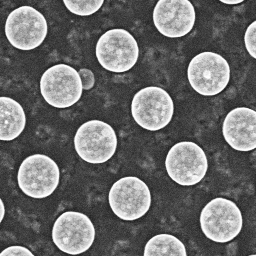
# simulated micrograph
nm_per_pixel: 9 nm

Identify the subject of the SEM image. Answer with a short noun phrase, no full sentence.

a regular array of raised bodies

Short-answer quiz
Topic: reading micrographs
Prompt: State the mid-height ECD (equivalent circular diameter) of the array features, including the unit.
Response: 42.1 px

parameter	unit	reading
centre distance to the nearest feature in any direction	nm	594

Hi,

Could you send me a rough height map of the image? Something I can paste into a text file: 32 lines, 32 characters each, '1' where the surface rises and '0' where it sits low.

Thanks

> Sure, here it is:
00000000111110000000111100000000
00111000011100000001111100000000
01111100000000000001111100000000
01111100000000000000111100000001
01111100000001110000011000000001
00111000000011111000000000000001
00000000000011111000000000000001
00000000000011111000000011110000
00000011100001110000000011111000
00000111110000000000000011111000
00000111110000000000000011110000
00000111110000000111100001100000
11000011110000000111100000000000
11100000000000001111110000000000
11100000000000000111100000001111
11100000000110000111100000001111
11100000001111000000000000001111
00000000011111100000000000001111
00000000011111000000001110000111
00001000001111000000011111000000
00011110000000000000011111000000
00111110000000000000011111000000
00111110000000011000001110000000
00011110000000111100000000000000
00001100000000111110000000000000
00000000000000111110000000111000
00000000100000111100000001111100
00000001111000000000000001111100
00000001111100000000000001111100
00000001111100000001100000111000
00000001111000000011111000000000
11110000110000000011111000000000